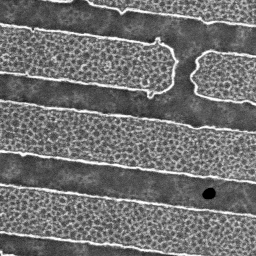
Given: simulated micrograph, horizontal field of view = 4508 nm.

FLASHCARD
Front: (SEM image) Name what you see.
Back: one or a few lines or trenches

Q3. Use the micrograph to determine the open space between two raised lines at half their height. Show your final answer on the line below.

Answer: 0.535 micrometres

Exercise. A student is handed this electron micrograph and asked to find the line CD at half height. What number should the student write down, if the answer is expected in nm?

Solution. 848